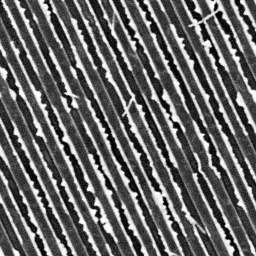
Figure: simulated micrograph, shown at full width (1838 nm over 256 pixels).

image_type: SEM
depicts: parallel lines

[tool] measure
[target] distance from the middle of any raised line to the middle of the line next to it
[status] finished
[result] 156 nanometres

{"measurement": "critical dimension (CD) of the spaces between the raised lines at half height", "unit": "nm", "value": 55.3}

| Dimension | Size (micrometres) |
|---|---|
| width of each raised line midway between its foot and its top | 0.104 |